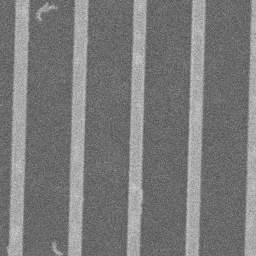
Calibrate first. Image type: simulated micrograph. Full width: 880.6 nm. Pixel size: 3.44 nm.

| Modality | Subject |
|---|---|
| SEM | parallel lines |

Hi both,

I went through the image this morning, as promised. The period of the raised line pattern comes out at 58.8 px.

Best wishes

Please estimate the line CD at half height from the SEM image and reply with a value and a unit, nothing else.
41.3 nm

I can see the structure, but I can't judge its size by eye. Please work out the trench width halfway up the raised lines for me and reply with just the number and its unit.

162 nm